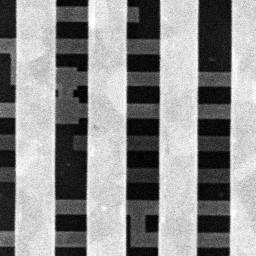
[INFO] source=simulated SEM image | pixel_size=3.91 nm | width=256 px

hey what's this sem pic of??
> wiring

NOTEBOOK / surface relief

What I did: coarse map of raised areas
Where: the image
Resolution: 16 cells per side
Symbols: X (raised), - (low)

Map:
-XX---XX--XX---X
-XX---XX--XX---X
-XX---XX--XX---X
-XX---XX--XX---X
-XX---XX--XX---X
-XX---XX--XX---X
-XX---XX--XX--XX
-XX---XX--XX--XX
-XX---XX--XX--XX
-XX--XXX--XX--XX
-XX--XXX--XX--XX
-XX--XXX--XX--XX
-XX--XXX--XX--XX
-XX--XXX--XX--XX
-XX--XXX--XX--XX
-XX--XXX--XX--XX